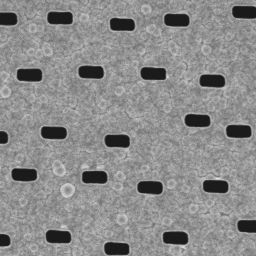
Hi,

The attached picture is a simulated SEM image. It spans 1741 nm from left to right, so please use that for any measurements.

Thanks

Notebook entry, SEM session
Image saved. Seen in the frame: a regular array of holes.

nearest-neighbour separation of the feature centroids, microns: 0.372